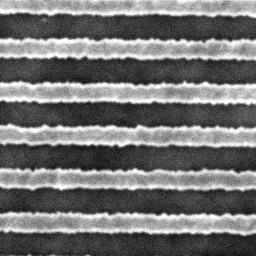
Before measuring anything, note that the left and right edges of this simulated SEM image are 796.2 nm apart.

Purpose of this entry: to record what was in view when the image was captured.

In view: lines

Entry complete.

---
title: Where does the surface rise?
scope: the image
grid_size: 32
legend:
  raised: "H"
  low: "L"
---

HHHHHHHHHHHHHHHHHHHHHHHHHHHHHHHH
HHHHHHHHHHHHHHHHHHHHHHHHHHHHHHHH
LLLLLLLLLLLLLLLLLLLLLLLLLLLLLLLL
LLLLLLLLLLLLLLLLLLLLLLLLLLLLLLLL
LLLLLLLLLLLLLLLLLLLLLLLLLLLLLLLL
HHHHHHHHHHHHHHHHHHHHHHHHHHHHHHHH
HHHHHHHHHHHHHHHHHHHHHHHHHHHHHHHH
LLLLLLLLLLLLLLLLLLLLLLLLLLLLLLLL
LLLLLLLLLLLLLLLLLLLLLLLLLLLLLLLL
LLLLLLLLLLLLLLLLLLLLLLLLLLLLLLLL
HHHHLHHHHHLLHHLHLLLLLLLHLHLLLLLL
HHHHHHHHHHHHHHHHHHHHHHHHHHHHHHHH
LHHHHHHHHHHHHHHHHHHHHHHHHHHHHHHH
LLLLLLLLLLLLLLLLLLLLLLLLLLLLLLLL
LLLLLLLLLLLLLLLLLLLLLLLLLLLLLLLL
LLLLLLLLLLLLLLLLLLLLLLLLLLLLLLLL
HHHHHHHHHHHHHHHHHHHHHHHHHHHHHHHH
HHHHHHHHHHHHHHHHHHHHHHHHHHHHHHHH
LLLLLLLLLLLLLLLLLLLLLLLLLLLLLLLL
LLLLLLLLLLLLLLLLLLLLLLLLLLLLLLLL
LLLLLLLLLLLLLLLLLLLLLLLLLLLLLLLL
HHHHHHHHHHHHHHHHHHLHHHHHHHHHHLHH
HHHHHHHHHHHHHHHHHHHHHHHHHHHHHHHH
LLLHHLLHHLLLLHHHHHHLHHHHHHHHHHHH
LLLLLLLLLLLLLLLLLLLLLLLLLLLLLLLL
LLLLLLLLLLLLLLLLLLLLLLLLLLLLLLLL
LLLLLLLLLLLLLLLLLLLLLLLLLLLLLLLL
HHHHHHHHHHHHHHHHHHHHHHHHHHHHHHHH
HHHHHHHHHHHHHHHHHHHHHHHHHHHHHHHH
LLLLLLLLLLLLLLLLLLLLLLLLLLLLLLLL
LLLLLLLLLLLLLLLLLLLLLLLLLLLLLLLL
LLLLLLLLLLLLLLLLLLLLLLLLLLLLLLLL